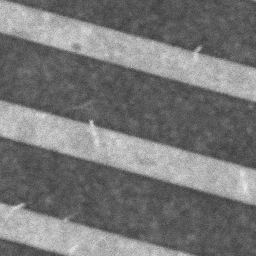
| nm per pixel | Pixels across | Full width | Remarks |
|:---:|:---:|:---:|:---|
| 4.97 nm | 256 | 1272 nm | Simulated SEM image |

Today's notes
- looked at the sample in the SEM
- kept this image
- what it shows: one or a few lines or trenches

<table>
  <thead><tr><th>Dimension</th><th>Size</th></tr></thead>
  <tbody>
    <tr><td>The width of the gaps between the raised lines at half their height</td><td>0.334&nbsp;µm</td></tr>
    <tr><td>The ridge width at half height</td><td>162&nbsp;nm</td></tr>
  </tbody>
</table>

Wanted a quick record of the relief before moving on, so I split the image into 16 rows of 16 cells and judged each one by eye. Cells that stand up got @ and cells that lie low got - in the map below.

@@--------------
@@@@@@----------
--@@@@@@@-------
------@@@@@@@---
---------@@@@@@@
-------------@@@
@---------------
@@@@------------
@@@@@@@@--------
----@@@@@@@@----
-------@@@@@@@@-
-----------@@@@@
---------------@
@@@-------------
@@@@@@@---------
---@@@@@@@------